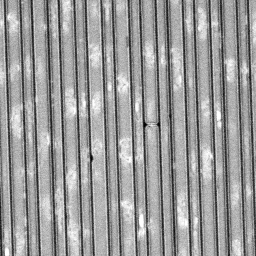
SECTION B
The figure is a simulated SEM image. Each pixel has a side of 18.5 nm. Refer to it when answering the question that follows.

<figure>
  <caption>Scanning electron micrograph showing parallel lines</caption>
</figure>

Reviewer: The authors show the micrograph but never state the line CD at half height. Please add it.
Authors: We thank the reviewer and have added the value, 76.2 nm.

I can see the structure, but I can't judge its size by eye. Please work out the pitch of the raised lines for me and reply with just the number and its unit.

0.25 µm